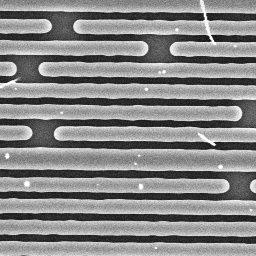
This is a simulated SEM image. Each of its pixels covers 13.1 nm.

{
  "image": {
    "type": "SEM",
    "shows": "groups of lines, slits or small figures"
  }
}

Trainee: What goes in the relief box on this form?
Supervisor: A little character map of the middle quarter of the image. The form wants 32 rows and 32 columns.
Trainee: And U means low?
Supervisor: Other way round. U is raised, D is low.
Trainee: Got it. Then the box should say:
UUUUUUUUUUUUUUUUUUUUUUUUUUUUUUUU
UUUUUUUUUUUUUUUUUUUUUUUUUUUUUUUU
UUUUUUUUUUUUUUUUUUUUUUUUUUUUUUUU
DDDDDDDDDDDDDDDDDDDDDDDDDDDDDDDD
DDDDDDDDDDDDDDDDDDDDDDDDDDDDDDDD
UUUUUUUUUUUUUUUUUUUUUUUUUUUUUUUU
UUUUUUUUUUUUUUUUUUUUUUUUUUUUUUUU
UUUUUUUUUUUUUUUUUUUUUUUUUUUUUUUU
DDDDDDDDDDDUUUDDDDDDDDDDDUUDUUUU
DDDDDDDDDDDDDDDDDDDDDDDDDDDDDDDD
UUUUUUUUDDDDDDDDDUUUDDDDDDDDDDDD
UUUUUUUUUUUUUUUUUUUUUUUUUUUUUUUU
UUUUUUUUUUUUUUUUUUUUUUUUUUUUUUUU
UUUUUUUUUUUUUUUUUUUUUUUUUUUUUUUU
DDDDDDDDDDDDDDDDDDDDDDDDDDDDDDDD
DDDDDDDDDDDDDDDDDDDDDDDDDDDDDDDD
UUUUUUUUUUUUUUUUUUUUUUUUUUUUUUUU
UUUUUUUUUUUUUUUUUUUUUUUUUUUUUUUU
UUUUUUUUUUUUUUUUUUUUUUUUUUUUUUUU
DDDDDDDDDDDDDDDDDDDDDDDDDDDDDDDD
DDDDDDDDDDDDDDDDDDDDDDDDDDDDDDDD
UUUUUUUUUUUUUUUDUUUUUUUUUUUUUUDD
UUUUUUUUUUUUUUUUUUUUUUUUUUUUUUUU
UUUUUUUUUUUUUUUUUUUUUUUUUUUUUUUU
UUUUUUUUUUUUUUUUUUUUUUUUUUUUUUUU
UUUUUUUUUUUUUUUUUUUUUUUUUUUUUUUU
DDDDUUUUUUUUUUUUUUUUUUUUUUUUUUUU
DDDDDDDDDDDDDDDDDDDDDDDDDDDDDDDD
UDDDDDDUUUUDDDDDDDDDDDUUDDDDDDDD
UUUUUUUUUUUUUUUUUUUUUUUUUUUUUUUU
UUUUUUUUUUUUUUUUUUUUUUUUUUUUUUUU
UUUUUUUUUUUUUUUUUUUUUUUUUUUUUUUU